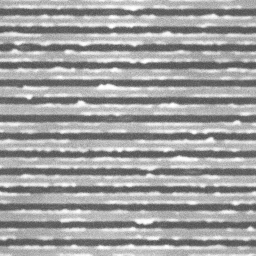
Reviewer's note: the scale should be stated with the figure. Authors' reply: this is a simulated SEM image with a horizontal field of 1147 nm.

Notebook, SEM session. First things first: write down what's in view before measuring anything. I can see parallel lines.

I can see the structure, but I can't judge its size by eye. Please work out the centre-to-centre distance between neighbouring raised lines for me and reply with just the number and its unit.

79.6 nm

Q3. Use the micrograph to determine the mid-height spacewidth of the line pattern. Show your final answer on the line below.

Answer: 8.01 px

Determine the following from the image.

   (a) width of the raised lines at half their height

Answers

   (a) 44.3 nanometers